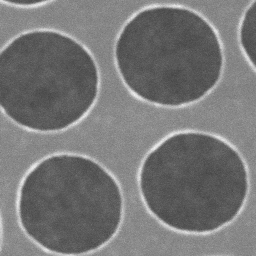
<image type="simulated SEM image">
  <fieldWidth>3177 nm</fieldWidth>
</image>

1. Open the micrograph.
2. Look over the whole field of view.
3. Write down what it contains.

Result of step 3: holes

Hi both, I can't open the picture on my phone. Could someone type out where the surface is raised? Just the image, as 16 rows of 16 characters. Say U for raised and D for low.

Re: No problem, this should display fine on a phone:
UUUUUUUUUDDUUUUU
UUUUUUUUDDDDDUUD
UDDDDUUDDDDDDDUD
DDDDDDUDDDDDDDUD
DDDDDDUUDDDDDDUU
DDDDDDUUDDDDDUUU
DDDDDDUUUUDUUUUU
UDDDDUUUUUUUUUUU
UUUUUUUUUUUDDUUU
UUUUUUUUUDDDDDDU
UUDDDDUUUDDDDDDU
UDDDDDDUUDDDDDDU
UDDDDDDDUDDDDDDU
UDDDDDDDUUDDDDDU
UUDDDDDUUUUUDUUU
UUUDDDUUUUUUUUUU